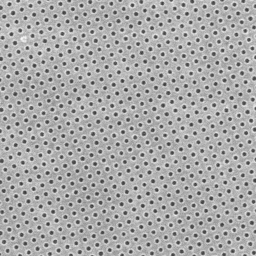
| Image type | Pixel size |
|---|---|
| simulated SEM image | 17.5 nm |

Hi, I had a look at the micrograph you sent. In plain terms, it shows a regular array of holes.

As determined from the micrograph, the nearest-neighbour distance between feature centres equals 163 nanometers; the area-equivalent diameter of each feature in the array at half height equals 83.9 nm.